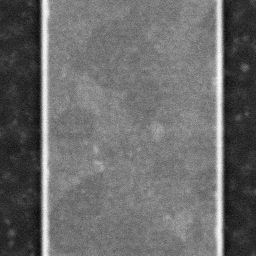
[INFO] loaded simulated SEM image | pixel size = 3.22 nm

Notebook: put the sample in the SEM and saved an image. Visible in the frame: one or a few lines or trenches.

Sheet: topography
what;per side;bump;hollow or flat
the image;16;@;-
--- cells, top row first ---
---@@@@@@@@@@@--
---@@@@@@@@@@@--
---@@@@@@@@@@@--
---@@@@@@@@@@@--
---@@@@@@@@@@@--
---@@@@@@@@@@@--
---@@@@@@@@@@@--
---@@@@@@@@@@@--
---@@@@@@@@@@@--
---@@@@@@@@@@@--
---@@@@@@@@@@@--
---@@@@@@@@@@@--
---@@@@@@@@@@@--
---@@@@@@@@@@@--
---@@@@@@@@@@@--
---@@@@@@@@@@@--